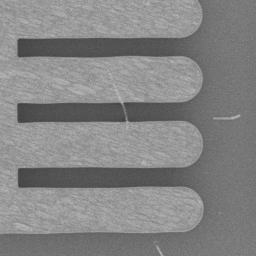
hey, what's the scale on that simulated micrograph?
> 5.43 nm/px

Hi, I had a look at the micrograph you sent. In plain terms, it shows groups of lines, slits or small figures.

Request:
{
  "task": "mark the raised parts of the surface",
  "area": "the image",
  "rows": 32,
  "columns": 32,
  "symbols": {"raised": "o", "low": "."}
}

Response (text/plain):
ooooooooooooooooooooooooo.......
ooooooooooooooooooooooooo.......
ooooooooooooooooooooooooo.......
ooooooooooooooooooooooooo.......
oooooooooooooooooooooooo........
oo..............................
oo..............................
oooooooooooooooooooooooo........
ooooooooooooooooooooooooo.......
ooooooooooooooooooooooooo.......
ooooooooooooooooooooooooo.......
ooooooooooooooooooooooooo.......
oooooooooooooooooooooooo........
oo..............................
oo..............................
oooooooooooooooooooooooo........
ooooooooooooooooooooooooo.......
ooooooooooooooooooooooooo.......
ooooooooooooooooooooooooo.......
ooooooooooooooooooooooooo.......
oooooooooooooooooooooooo........
oo..............................
oo..............................
ooo.............ooooooo.........
ooooooooooooooooooooooooo.......
ooooooooooooooooooooooooo.......
ooooooooooooooooooooooooo.......
ooooooooooooooooooooooooo.......
oooooooooooooooooooooooo........
................................
................................
................................